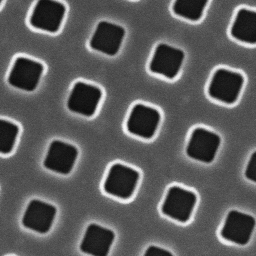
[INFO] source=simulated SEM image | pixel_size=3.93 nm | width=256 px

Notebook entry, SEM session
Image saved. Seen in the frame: a regular array of holes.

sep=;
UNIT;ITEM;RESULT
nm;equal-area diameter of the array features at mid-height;129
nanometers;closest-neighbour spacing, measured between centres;248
